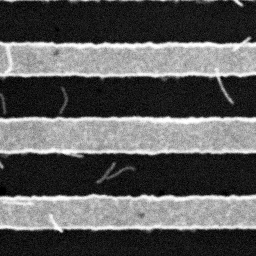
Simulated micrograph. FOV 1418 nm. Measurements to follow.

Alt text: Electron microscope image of lines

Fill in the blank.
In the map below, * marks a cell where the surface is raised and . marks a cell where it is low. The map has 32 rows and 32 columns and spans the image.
................................
................................
................................
................................
................................
**.***........................*.
********************************
********************************
********************************
............**.*...*......**....
................................
................................
................................
................................
................................
********************************
********************************
********************************
********************************
................................
................................
................................
................................
................................
...........*....................
********************************
********************************
********************************
*******************.************
................................
................................
................................